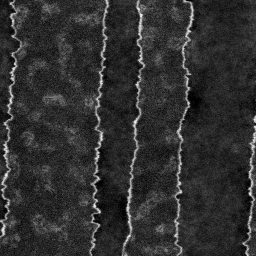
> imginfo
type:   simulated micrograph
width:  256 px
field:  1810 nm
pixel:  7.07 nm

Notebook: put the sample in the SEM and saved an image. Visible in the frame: one or a few lines or trenches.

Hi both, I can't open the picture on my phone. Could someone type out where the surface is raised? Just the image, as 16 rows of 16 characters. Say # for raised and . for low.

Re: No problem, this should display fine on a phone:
.######..###....
.######..###....
.######..###....
.#####...###....
.#####...###....
.#####...###....
.#####...###....
######...##.....
######..###.....
######..###.....
######..###.....
######..###.....
######..###.....
######..###.....
######..###.....
######..###....#